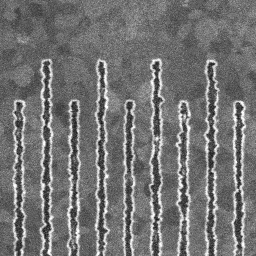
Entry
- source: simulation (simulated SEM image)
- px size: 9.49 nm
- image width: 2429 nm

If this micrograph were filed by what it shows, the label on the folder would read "parallel lines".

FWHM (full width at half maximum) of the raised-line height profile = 195 nm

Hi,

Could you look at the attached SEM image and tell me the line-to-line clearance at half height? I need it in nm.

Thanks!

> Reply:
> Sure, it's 67.6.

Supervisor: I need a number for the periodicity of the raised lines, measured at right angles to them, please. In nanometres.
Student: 260